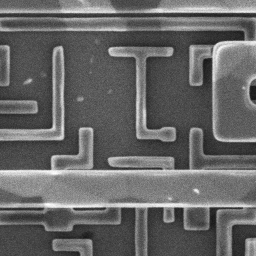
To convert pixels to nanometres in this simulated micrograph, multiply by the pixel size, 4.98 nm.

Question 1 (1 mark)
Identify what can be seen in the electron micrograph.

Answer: wiring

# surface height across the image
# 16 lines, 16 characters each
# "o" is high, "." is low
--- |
oooooooooooooooo
................
................
.............ooo
.............ooo
.............ooo
.............ooo
.............ooo
..............oo
................
................
oooooooooooooooo
oooooooooooooooo
................
................
................